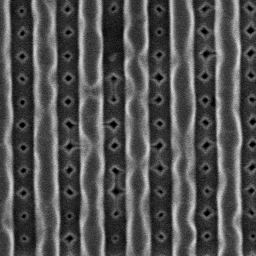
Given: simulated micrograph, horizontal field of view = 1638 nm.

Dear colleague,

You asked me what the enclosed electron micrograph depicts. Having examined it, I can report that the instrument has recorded wiring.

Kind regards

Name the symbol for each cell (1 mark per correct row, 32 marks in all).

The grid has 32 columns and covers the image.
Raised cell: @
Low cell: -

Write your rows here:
@---@@----@@@---@@---@@@---@@@--
@---@@@---@@@---@@---@@@---@@@--
@----@@---@@----@@---@@@---@@@--
@---@@@---@@----@@---@@@---@@@--
@---@@@---@@@---@@---@@@---@@@--
@---@@@---@@@---@@----@@---@@@--
@---@@@---@@@---@@----@@---@@@--
@---@@@---@@@---@@----@@---@@@--
@----@@---@@@---@@----@@---@@@--
@----@@---@@@---@@---@@@---@@@--
@----@@---@@@---@@---@@@---@@@--
@----@@---@@----@@----@@---@@@--
@----@@---@@@---@@----@@---@@@--
@----@@---@@@---@@----@@---@@@--
@----@@---@@@---@@----@@---@@@--
@----@@---@@@---@@----@@---@@@--
@---@@@---@@@---@@----@@---@@@--
@---@@@---@@@---@@----@@---@@@--
@---@@@----@@---@@----@@---@@@--
@---@@@---@@@---@@----@@---@@@--
@----@@---@@@---@@----@@---@@@--
@----@@---@@@---@@----@@---@@@--
@----@@---@@@---@@----@@----@@--
@----@@---@@@---@@----@@----@@--
@----@@---@@@---@@----@@---@@@--
@----@@----@@---@@----@@---@@@--
@----@@---@@@---@@----@@---@@@--
@----@@---@@@---@@----@@---@@@--
@----@@---@@@---@@----@@---@@@--
@@---@@---@@@---@@@---@@---@@@--
@@---@@---@@@---@@@---@@----@@--
@@---@@---@@@---@@----@@---@@@--